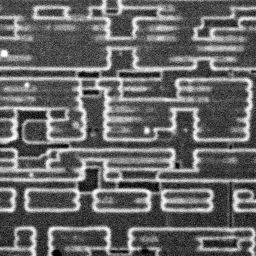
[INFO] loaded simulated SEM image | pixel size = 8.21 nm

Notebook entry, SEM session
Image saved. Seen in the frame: wiring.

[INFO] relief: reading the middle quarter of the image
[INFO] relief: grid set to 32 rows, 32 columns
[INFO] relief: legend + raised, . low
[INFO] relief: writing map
+++++++++++......+++++++++++++++
................................
................................
................................
++++....++++++..............++++
++++....++++++..............++++
++++......++++...............+++
++++......++++..............++++
++++.......+++..............++++
++++.......+++++++++++++++++++++
++++.......+++++++++++++++++++++
.++++......+++++++++++++++++....
+++++.....++++++++++++++++++....
+++++......++++++++++++++++.....
+++++.....++++++++++++++++++....
+++++.....++++++++++++++++++....
+++++.....+++++++++++++.........
+++++.....+++++++++++++.........
+++++.....+++++++++++++.........
................................
................................
.+++............................
++++++++++++++++++++++++++++....
+++++++++++++++++++++++++++.....
+++++.....+++++++++++++++++.....
+++++.....+++++++++++++++++.....
++++......++++......++++++......
++++......++++.........+++++++++
++++......++++.........+++++++++
................................
................................
................................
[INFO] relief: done